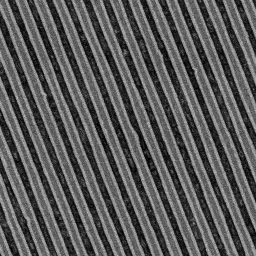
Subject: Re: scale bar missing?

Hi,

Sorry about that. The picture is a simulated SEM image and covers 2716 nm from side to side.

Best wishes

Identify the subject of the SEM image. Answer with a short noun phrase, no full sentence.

parallel lines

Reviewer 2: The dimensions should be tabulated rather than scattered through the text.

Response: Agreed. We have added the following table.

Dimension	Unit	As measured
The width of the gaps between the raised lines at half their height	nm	95.1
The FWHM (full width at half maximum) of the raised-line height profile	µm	0.0865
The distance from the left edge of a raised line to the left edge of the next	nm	186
